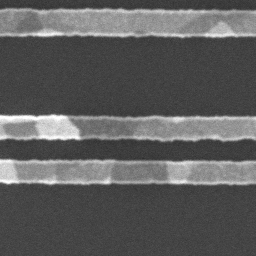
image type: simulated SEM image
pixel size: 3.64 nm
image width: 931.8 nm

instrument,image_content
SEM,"lines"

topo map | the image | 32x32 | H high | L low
LLLLLLLLLLLLLLLLLLLLLLLLLLLLLLLL
HHHHHHHHHHHHHHHHHHHHHHHHHHHHHHHH
HHHHHHHHHHHHHHHHHHHHHHHHHHHHHHHH
HHHHHHHHHHHHHHHHHHHHHHHHHHHHHHHH
LLLLLLLLLLLLLLLLLHLLLLHHLLHHLLLL
LLLLLLLLLLLLLLLLLLLLLLLLLLLLLLLL
LLLLLLLLLLLLLLLLLLLLLLLLLLLLLLLL
LLLLLLLLLLLLLLLLLLLLLLLLLLLLLLLL
LLLLLLLLLLLLLLLLLLLLLLLLLLLLLLLL
LLLLLLLLLLLLLLLLLLLLLLLLLLLLLLLL
LLLLLLLLLLLLLLLLLLLLLLLLLLLLLLLL
LLLLLLLLLLLLLLLLLLLLLLLLLLLLLLLL
LLLLLLLLLLLLLLLLLLLLLLLLLLLLLLLL
LLLLLLLLLLLLLLLLLLLLLLLLLLLLLLLL
LLLLLLLLLLLLLLLLLLLLLLLLLLLLLLLL
HHHHHHHHHHHHHHHHHHHHHHHHHHHHHHHH
HHHHHHHHHHHHHHHHHHHHHHHHHHHHHHHH
LLLLLLLLLLLLLLLLLLLHHHLHHLLLHHLL
LLLLLLLLLLLLLLLLLLLLLLLLLLLLLLLL
LLLLLLLLLLLLLLLLLLLLLLLLLLLLLLLL
HHHHHHHHHHHHHHHHHHHHHHHHHHHHHHHH
HHHHHHHHHHHHHHHHHHHHHHHHHHHHHHHH
HHHHHHHHHHHHHHHHHHHHHHHHHHHHHHHH
LLLLLLLLLLLLLLLLLLLLLLLLLLLLLLLL
LLLLLLLLLLLLLLLLLLLLLLLLLLLLLLLL
LLLLLLLLLLLLLLLLLLLLLLLLLLLLLLLL
LLLLLLLLLLLLLLLLLLLLLLLLLLLLLLLL
LLLLLLLLLLLLLLLLLLLLLLLLLLLLLLLL
LLLLLLLLLLLLLLLLLLLLLLLLLLLLLLLL
LLLLLLLLLLLLLLLLLLLLLLLLLLLLLLLL
LLLLLLLLLLLLLLLLLLLLLLLLLLLLLLLL
LLLLLLLLLLLLLLLLLLLLLLLLLLLLLLLL